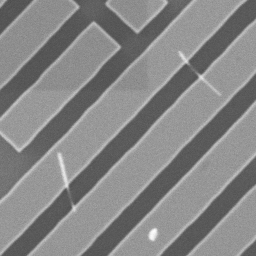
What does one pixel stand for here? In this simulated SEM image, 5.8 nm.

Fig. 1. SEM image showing groups of lines, slits or small figures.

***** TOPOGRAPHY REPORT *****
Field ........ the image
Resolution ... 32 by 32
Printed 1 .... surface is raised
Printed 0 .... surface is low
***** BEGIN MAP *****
00001111110001111111100011111100
00011111100000111111000111111000
00111111000000011110001111110000
01111110000110001100011111100001
11111100001111000000111111000011
11111100011111100001111110000111
11111000111111100011111110001111
11110001111111000111111100011111
11100011111110001111111000111111
11000111111100011111110001111111
10001111111000111111100011111110
00011111110001111111000111111100
00111111100011111110001111111000
01111111000111111100011111110001
11111110001111111000111111100011
11111100011111110001111111000111
11111000111111100011111110001111
01110001111111000111111100011111
00100011111110001111111000111111
00000111111100011111110001111111
00000111111000111111100001111110
00011111110000111111000011111100
00011111100001111110000111111000
00111111000011111100001111110000
01111110000111111000011111100001
11111100001111110000111111000011
11111000011111100001111110000111
11110000111111000011111100001111
11100001111110000111111000011111
11000011111100001111110000111111
10000111111000011111100001111110
00001111111000111111000011111100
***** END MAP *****